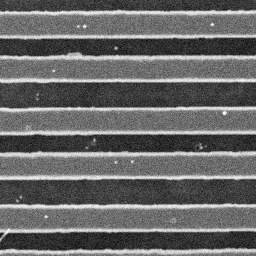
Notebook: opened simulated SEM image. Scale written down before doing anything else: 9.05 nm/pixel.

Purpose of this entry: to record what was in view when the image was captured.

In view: lines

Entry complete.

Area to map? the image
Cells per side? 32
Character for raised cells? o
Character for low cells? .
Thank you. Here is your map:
................................
.........o..ooooooo...o.o.oooooo
oooooooooooooooooooooooooooooooo
oooooooooooooooooooooooooooooooo
oooooooooooooooooooooooooooooooo
................................
................................
oooooooooooooooooooooooooooooooo
oooooooooooooooooooooooooooooooo
oooooooooooooooooooooooooooooooo
................................
................................
................................
.........................o....oo
oooooooooooooooooooooooooooooooo
oooooooooooooooooooooooooooooooo
oooooooooooooooooooooooooooooooo
................................
................................
oooooooooooooooooooooooooooooooo
oooooooooooooooooooooooooooooooo
oooooooooooooooooooooooooooooooo
................................
................................
................................
................................
oooooooooooooooooooooooooooooooo
oooooooooooooooooooooooooooooooo
oooooooooooooooooooooooooooooooo
................................
................................
oooooooooooooooooooooooooooooooo